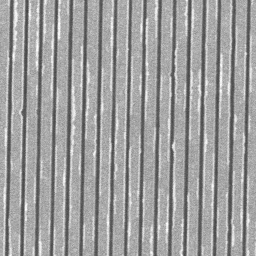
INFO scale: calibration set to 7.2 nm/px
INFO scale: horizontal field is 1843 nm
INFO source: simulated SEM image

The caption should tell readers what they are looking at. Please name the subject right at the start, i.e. parallel lines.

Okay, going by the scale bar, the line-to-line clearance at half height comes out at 32.4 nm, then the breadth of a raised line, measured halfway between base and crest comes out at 77.3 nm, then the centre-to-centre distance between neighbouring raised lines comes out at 107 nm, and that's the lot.